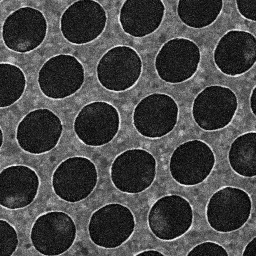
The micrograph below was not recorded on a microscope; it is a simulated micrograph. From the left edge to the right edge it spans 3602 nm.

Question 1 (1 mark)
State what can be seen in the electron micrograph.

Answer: a regular array of holes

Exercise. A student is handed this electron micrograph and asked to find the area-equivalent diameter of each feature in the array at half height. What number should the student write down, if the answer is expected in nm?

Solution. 635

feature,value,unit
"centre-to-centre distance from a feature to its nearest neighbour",828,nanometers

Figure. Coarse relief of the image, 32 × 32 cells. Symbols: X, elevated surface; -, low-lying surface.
XXXXXXXXX---XXX-----XX------XX--
XX---XXX-----XX------X------XX--
X-----XX-----XX-----XXX----XXXX-
------XX-----XX-----XXXXXXXXXXXX
------XX----XXXXX-XXXXXXXXXX----
X----XXXX-XXXXXXXXXXX---XXX-----
XX--XXXXXXXXX----XXX-----XX-----
XXXXXX----XXX-----X------XX-----
--XXX-----XX------X------XX----X
---XX------X-----XXX----XXXXXXXX
---XX-----XXX----XXXXXXXXXXXXXXX
---XX----XXXXXXXXXXXXXXXX----XXX
--XXXXXXXXXXXXXXXX----XX------X-
XXXXXXXXXX----XXX-----XX------X-
XXX----XXX-----XX-----XX-----XXX
XX------X------XX-----XXX----XXX
XX------X------XX----XXXXXXXXXXX
XX-----XXX----XXXXXXXXXXXXXXX---
XXX----XXXXXXXXXXXXXXX----XXX---
XXXXXXXXXXXXXXX----XX------XX---
XXXXXXX-----XX-----XX------XX---
----XXX-----XX-----XX-----XXXX--
-----XX-----XX-----XXX----XXXXXX
-----XX-----XXX---XXXXXXXXXX--XX
----XXX----XXXXXXXXXX-XXXXX----X
----XXXXXXXXXX-XXXX-----XX-----X
XXXXXX--XXXX----XXX-----XX-----X
XXXXX----XX------X------XX-----X
--XX-----XX------XX-----XXX---XX
--XX-----XX-----XXXX---XXXXXXXXX
--XX-----XXX---XXXXXXXXXX--XXXX-
--XXX---XXXXXXXXXX--XXXX----XX--